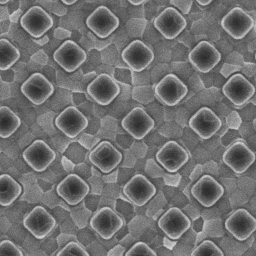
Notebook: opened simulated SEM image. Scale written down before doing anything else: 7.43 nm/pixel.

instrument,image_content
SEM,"a regular array of raised bodies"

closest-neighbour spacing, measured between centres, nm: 345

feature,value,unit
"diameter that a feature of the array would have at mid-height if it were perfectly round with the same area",214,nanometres